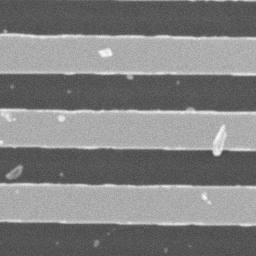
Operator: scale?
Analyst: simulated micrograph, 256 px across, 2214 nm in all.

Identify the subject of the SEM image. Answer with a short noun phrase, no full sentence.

lines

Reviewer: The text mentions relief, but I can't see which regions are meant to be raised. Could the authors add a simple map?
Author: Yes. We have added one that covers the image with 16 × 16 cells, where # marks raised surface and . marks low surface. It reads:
................
................
################
################
################
................
................
################
################
.............#..
................
####............
################
################
................
................